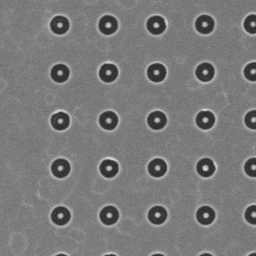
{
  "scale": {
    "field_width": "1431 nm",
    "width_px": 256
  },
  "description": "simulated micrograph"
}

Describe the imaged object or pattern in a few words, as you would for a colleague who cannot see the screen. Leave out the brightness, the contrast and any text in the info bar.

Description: a regular array of ring-shaped grooves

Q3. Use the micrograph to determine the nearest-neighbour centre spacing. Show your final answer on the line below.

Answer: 266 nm